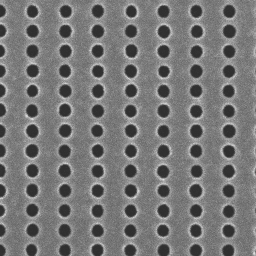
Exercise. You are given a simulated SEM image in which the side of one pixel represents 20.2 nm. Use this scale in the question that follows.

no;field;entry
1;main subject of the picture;a regular array of holes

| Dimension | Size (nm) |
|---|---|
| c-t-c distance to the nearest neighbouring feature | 399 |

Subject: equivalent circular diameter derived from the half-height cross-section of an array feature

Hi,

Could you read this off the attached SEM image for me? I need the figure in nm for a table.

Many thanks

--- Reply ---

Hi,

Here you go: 266